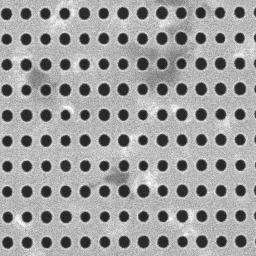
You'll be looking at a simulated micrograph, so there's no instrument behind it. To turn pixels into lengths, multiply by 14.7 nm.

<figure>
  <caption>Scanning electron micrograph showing a regular array of holes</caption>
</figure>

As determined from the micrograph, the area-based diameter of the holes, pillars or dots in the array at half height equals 172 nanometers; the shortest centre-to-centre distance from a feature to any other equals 0.283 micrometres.